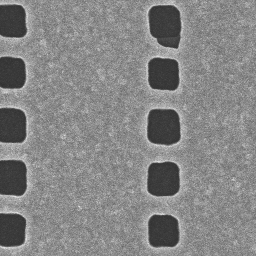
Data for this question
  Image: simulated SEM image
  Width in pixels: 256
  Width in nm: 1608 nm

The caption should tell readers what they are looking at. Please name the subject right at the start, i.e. holes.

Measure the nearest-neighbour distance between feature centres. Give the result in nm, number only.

328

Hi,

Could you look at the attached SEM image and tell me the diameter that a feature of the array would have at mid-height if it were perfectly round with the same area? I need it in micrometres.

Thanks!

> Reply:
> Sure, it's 0.224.